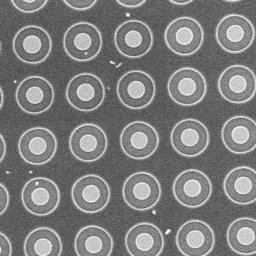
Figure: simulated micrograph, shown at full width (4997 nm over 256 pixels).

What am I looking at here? an array of small figures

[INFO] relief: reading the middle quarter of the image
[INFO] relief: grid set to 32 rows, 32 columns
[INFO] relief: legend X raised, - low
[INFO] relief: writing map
XXXXXXXXXXXXXXXXXXXXXXXXXXXXXXXX
XXXXXXXXXXXXXXXXXXXXXXXXXXXXX---
XXXXXXXXXXXXXXXX----XXXXXXXX----
XXX-----XXXXXXX------XXXXXX-----
XX-------XXXXX----X---XXXX---XXX
X---XXX---XXXX--XXXX--XXXX---XXX
X--XXXX---XXX---XXXX---XXX---XXX
X--XXXX---XXXX--XXXX--XXXXX---XX
X---XXX---XXXX--------XXXXX-----
XX-------XXXXXX------XXXXXXX----
XXX-----XXXXXXXX----XXXXXXXXXXXX
XXXXX-XXXXXXXXXXXXXXXXXXXXXXXXXX
XXXXXXXXXXXXXXXXXXXXXXXXXXXXXXXX
XXXXXXXXXXXXXXXXXXXXXXXXXXXXXXXX
XXXXXXXXXXXXXXXXXX-XXXXXXXXXXX--
XXXX----XXXXXXXX-----XXXXXXX----
XXX------XXXXXX-------XXXXX---XX
XX--------XXXXX---XX---XXXX--XXX
XX---XXX--XXXX---XXXX--XXXX--XXX
XX--XXXX---XXX---XXXX--XXXX---XX
XX--XXXX--XXXXX--XXX---XXXX-----
XX---XX---XXXXX-------XXXXXX----
XXX------XXXXXXX-----XXXXXXXXX--
XXXX----XXXXXXXXXX-XXXXXXXXXXXXX
XXXXXXXXXXXXXXXXXXXXXXXXXXXXXXXX
XXXXXXXXXXXXXXXXXXXXXXXXXXXXXXXX
XXXXXXXXXXXXXXXXXXXXXXXXXXXXXXXX
XXXXXXXXXXXXXXXXXX---XXXXXXXXX--
XXXXX----XXXXXXX------XXXXXX----
XXX-------XXXXXX-------XXXXX---X
XXX---X----XXXX---XXX---XXXX--XX
XX---XXXX--XXXX--XXXX---XXX---XX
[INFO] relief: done